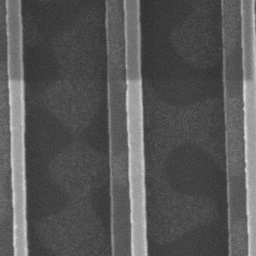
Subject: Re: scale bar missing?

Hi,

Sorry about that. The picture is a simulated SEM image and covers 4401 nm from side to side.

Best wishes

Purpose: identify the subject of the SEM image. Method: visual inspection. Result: lines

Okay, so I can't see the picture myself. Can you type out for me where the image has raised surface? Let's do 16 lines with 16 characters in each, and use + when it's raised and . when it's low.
+......++.....++
+......++.....++
+......++.....++
+......++.....++
+......++.....++
+......++.....++
+......++.....++
+......++.....++
++.....++.....++
++.....++.....++
++.....++.....++
++.....++.....++
++.....++.....++
++.....++.....++
++.....++.....++
++.....++.....++